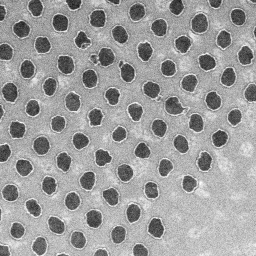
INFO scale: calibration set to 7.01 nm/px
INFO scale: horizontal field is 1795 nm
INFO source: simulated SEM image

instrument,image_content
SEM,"a regular array of raised bodies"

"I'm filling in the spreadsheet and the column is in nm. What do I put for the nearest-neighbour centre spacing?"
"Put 188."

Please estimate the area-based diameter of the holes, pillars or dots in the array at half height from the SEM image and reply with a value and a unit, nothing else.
125 nm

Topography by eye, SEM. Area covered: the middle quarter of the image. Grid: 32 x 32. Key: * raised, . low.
***......**...***.......****....
**....*.......****......****....
*....***......****.......***....
.....***......****............**
.....***.......**....**......***
.....***............****.....***
...........**.......****......**
.**.......****......****........
****......****........**..**....
****.......***...........****...
****............***......*****..
.***...**.......****.....******.
......****......****......***...
......****.......**............*
......***.............***......*
......................****.....*
............****......****......
...**.......****......***.......
..****......****............**..
..****.......*.............****.
..****............***......****.
........**........****......***.
*.......****......****..........
**......****.......**...........
**......****............***.....
**.......*....***.......***.....
*............****......****.....
.....***.....****.......**......
....****......***.............**
....****.......*.....*........**
....***.............***.......**
.....**...***.......****......**